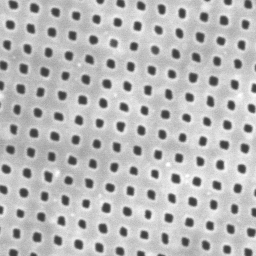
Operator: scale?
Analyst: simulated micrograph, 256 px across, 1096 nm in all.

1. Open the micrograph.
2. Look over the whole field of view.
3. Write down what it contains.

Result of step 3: a regular array of holes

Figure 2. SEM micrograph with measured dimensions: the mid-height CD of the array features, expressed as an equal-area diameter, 9.51 px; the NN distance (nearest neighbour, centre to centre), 0.086 microns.